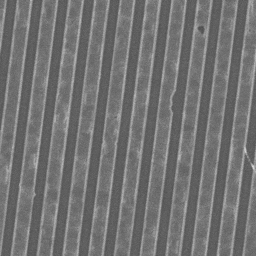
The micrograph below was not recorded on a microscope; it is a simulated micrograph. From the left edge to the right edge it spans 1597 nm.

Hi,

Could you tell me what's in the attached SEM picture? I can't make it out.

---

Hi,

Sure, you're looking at parallel lines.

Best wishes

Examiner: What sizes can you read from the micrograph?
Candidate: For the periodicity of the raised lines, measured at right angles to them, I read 25.5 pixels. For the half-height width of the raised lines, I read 92.1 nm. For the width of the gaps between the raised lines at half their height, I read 0.065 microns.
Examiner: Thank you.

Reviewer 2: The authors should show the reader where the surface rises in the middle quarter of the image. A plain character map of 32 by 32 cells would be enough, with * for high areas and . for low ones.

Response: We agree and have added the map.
***...***...***...****...***...*
**....***...***...****...***...*
**....***...***...****...***...*
**...****...***...****...***...*
**...****...***...****...***...*
**...****...***...***...****...*
**...****..****...***...****...*
**...***...****...***...***....*
**...***...***....***...***...**
*....***...***....***...***...**
*....***...***...****...***...**
*...****...***...****...***...**
*...****...***...****...***...**
*...****...*.*...***...****...**
*...***...****...***...****...**
*...***...****...***...****...**
*...***...****...***...***...***
....***...***....***...***...***
*...***...***...****...***...***
...****...***...****...***...***
...****...***...****...***...***
...****...***...***...****...***
...***...****...***...****...***
...***...****...***...****....**
...*.*...****...***...***...****
...***...***....***...***...****
...***...***...****...***...****
..****...***...****...***...****
..****...***...****...***...***.
..****...***...***...****...***.
..***...****...***...****...***.
..***...****...***...****...***.